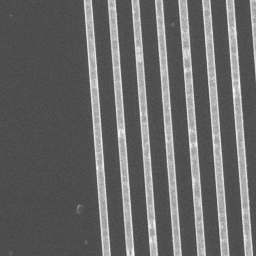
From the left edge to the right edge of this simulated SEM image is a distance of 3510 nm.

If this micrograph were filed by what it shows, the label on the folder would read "parallel lines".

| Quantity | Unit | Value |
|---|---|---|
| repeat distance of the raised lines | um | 0.324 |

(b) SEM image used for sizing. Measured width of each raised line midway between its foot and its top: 101 nm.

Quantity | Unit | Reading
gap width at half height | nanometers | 222